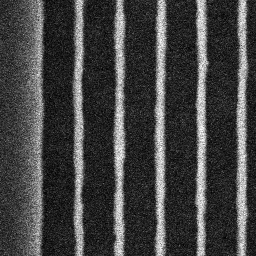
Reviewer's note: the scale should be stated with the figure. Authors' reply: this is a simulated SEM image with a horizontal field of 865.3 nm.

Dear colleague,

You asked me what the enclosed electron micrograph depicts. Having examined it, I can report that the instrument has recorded parallel lines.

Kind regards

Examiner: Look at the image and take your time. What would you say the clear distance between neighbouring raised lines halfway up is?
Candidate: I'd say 111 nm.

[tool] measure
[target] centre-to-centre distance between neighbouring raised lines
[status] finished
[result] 40.8 px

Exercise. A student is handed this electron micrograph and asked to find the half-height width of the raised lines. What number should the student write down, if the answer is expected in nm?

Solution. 25.3